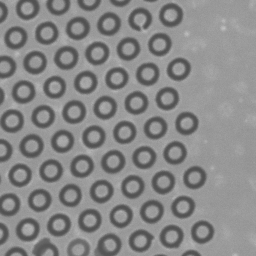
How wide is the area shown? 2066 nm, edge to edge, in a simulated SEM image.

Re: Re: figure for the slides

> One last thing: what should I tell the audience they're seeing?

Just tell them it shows a regular array of ring-shaped grooves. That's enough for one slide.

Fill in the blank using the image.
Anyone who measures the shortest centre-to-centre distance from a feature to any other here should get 0.252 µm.